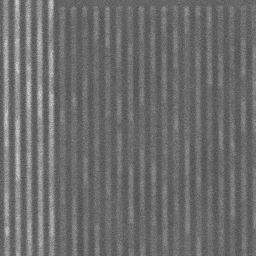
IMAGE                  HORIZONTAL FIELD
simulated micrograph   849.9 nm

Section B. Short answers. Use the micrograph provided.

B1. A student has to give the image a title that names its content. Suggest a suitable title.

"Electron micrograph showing parallel lines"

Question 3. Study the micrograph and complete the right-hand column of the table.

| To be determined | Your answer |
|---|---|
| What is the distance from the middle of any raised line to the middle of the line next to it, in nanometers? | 37.5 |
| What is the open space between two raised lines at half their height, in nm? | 25.7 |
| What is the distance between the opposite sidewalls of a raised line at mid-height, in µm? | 0.0129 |